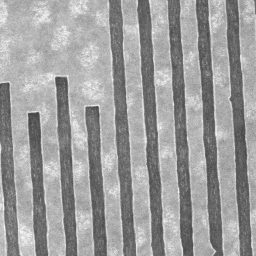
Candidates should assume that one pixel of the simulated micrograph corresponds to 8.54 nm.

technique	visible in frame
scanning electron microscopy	parallel lines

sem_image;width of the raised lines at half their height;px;17.1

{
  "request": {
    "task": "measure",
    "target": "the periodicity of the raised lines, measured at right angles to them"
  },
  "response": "249 nanometers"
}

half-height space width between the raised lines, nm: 106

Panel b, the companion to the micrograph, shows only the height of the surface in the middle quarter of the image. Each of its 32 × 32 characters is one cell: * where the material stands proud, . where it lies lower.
************...****....****...**
************...****....****...**
************...****....****...**
.***********....***...*****...**
.***********...****....****...**
.***********...*****...****...**
.***********...*****...****...**
.***********....****...****...**
.***********....****...****...**
.************...****...****...**
.*****..*****...****...****...**
.****....****...****...*****...*
.****....****...****...****....*
..***....****...****...****....*
..***....****...****...*****...*
..****...****...****...*****...*
..****...****...****...*****...*
..****...****...****....****...*
..****...****...*****...****...*
..****...****...*****...****...*
..****...****....****...****...*
..****...****....***....****...*
..****...****....***....****...*
..****...****....****...****...*
..****...****....****...****...*
..****...****....****...****...*
..****...****....****...****...*
..****....***....****...****....
..****....****...****...****....
..****....****...****...****....
...***....****...****...*****...
...***....****...****....****...